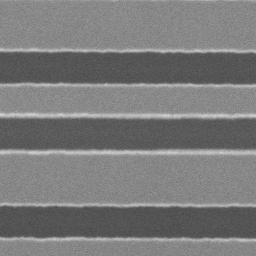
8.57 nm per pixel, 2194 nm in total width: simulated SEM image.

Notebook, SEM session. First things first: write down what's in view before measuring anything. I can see lines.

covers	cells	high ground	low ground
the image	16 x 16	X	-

XXXXXXXXXXXXXXXX
XXXXXXXXXXXXXXXX
XXXXXXXXXXXXXXXX
----------------
----------------
XXXXXXXXXXXXXXXX
XXXXXXXXXXXXXXXX
----------------
----------------
X---------------
XXXXXXXXXXXXXXXX
XXXXXXXXXXXXXXXX
XXXXXXXXXXXXXXXX
----------------
----------------
XXXXXXXXXXXXXXXX